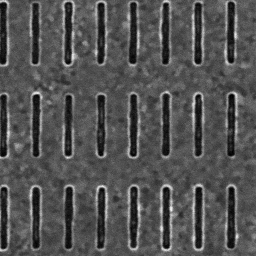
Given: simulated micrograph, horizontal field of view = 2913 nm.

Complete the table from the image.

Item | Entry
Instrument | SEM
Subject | a regular array of holes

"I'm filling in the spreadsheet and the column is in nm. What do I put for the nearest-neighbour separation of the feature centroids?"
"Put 368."